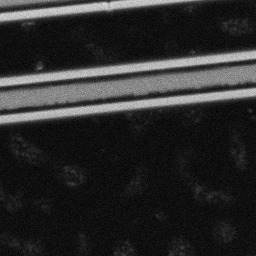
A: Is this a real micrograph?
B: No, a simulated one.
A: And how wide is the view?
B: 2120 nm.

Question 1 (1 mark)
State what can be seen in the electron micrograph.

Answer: one or a few lines or trenches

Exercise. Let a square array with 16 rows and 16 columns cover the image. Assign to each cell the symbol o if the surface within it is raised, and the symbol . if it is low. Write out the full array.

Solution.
.....ooooooooooo
oooooooooooooooo
oooooooooooooooo
ooooooooooooooo.
oooooo..........
................
........oooooooo
oooooooooooooooo
oooooooooooooooo
oooooooooooooooo
oooooooooooooooo
oooooooooooooooo
oooooooooooooooo
oooooooooooooooo
oooooooooooooooo
oooooooooooooooo